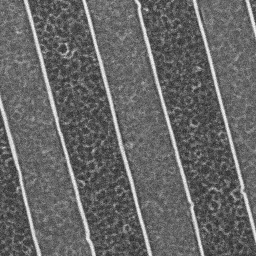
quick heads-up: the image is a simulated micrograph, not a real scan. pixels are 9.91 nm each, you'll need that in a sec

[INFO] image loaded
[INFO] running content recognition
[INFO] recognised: one or a few lines or trenches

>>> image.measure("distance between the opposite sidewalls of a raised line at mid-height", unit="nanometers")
559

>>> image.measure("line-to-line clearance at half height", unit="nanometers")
502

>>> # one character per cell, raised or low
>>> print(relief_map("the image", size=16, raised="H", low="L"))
LLHHHLLLLHHHLLLL
LLHHHHLLLHHHHLLL
LLHHHHLLLHHHHLLL
LLLHHHLLLHHHHLLL
LLLHHHLLLLHHHLLL
LLLHHHHLLLHHHHLL
LLLHHHHLLLHHHHLL
LLLLHHHLLLHHHHLL
HLLLHHHLLLLHHHLL
HLLLHHHHLLLHHHHL
HLLLHHHHLLLHHHHL
HLLLLHHHLLLLHHHL
HHLLLHHHLLLLHHHL
HHLLLHHHHLLLHHHH
HHLLLHHHHLLLHHHH
HHLLLLHHHLLLLHHH